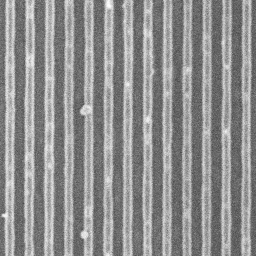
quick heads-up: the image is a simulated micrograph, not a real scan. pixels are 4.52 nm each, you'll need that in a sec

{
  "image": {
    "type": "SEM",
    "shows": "parallel lines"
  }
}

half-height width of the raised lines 0.0339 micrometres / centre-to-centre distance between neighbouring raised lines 89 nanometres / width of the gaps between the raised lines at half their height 55.4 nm